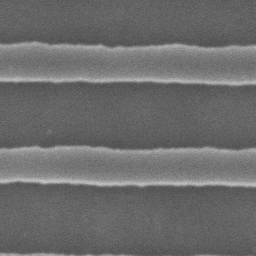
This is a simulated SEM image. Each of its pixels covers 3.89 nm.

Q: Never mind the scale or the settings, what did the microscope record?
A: lines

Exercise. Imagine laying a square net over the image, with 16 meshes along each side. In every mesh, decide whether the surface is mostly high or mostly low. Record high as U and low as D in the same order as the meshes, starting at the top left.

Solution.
DDDDDDDDDDDDDDDD
DDDDDDDDDDDDDDDD
DDDDDDDDDDDDDDDD
UUUUUUUUUUUUUUUU
UUUUUUUUUUUUUUUU
DDDDDDDDDDDDDDDD
DDDDDDDDDDDDDDDD
DDDDDDDDDDDDDDDD
DDDDDDDDDDDDDDDD
UUUUUUUUUUUUUUUU
UUUUUUUUUUUUUUUU
DDDDDDUUUUUUUUUU
DDDDDDDDDDDDDDDD
DDDDDDDDDDDDDDDD
DDDDDDDDDDDDDDDD
DDDDDDDDDDDDDDDD